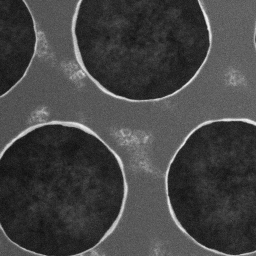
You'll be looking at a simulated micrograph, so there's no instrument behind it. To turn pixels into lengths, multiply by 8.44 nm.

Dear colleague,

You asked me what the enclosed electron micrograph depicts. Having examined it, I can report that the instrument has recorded holes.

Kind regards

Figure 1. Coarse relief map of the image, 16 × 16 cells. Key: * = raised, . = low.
..***........***
..***........***
..***........***
..***........***
..***.......****
.*****.....*****
****************
****************
*.....******....
.......****.....
........***.....
........**......
........***.....
.......****.....
.......*****....
*.....*******...